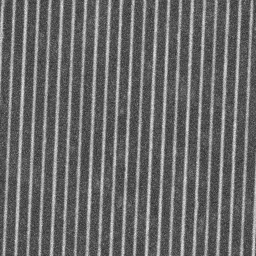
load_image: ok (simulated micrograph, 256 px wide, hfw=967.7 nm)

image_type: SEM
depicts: parallel lines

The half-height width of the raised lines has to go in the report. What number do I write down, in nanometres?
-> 9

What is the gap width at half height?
9.74 pixels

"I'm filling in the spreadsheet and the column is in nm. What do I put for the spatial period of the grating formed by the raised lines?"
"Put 44.9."